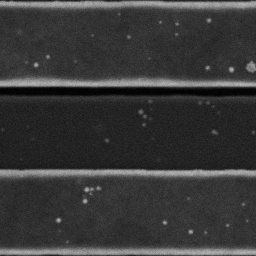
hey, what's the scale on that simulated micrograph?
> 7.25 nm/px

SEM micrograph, lines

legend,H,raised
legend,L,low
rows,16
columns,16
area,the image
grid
HHHHHHHHHHHHHHHH
HHHHHHHHHHHHHHHH
HHHHHHHHHHHHHHHH
HHHHHHHHHHHHHHHH
HHHHHHHHHHHHHHHH
LLLLLLLLLLLLLLLL
LLLLLLLLLLLLLLLL
LLLLLLLLLLLLLLLL
LLLLLLLLLLLLLLLL
LLLLLLLLLLLLLLLL
LLLLLLLLLLLLLLLL
HHHHHHHHHHHHHHHH
HHHHHHHHHHHHHHHH
HHHHHHHHHHHHHHHH
HHHHHHHHHHHHHHHH
HHHHHHHHHHHHHHHH